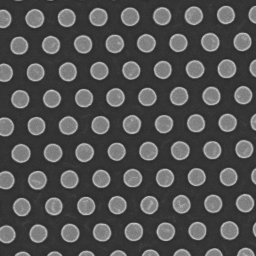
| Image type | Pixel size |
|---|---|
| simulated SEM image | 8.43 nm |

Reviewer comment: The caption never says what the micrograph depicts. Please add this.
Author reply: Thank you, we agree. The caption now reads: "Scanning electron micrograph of a regular array of raised bodies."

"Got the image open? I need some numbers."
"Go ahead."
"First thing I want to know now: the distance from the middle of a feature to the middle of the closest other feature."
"0.26 µm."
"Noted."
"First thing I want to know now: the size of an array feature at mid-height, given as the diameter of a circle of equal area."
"155 nm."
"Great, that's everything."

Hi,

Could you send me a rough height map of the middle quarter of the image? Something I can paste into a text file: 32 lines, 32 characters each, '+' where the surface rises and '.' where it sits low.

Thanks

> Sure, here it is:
+++....++++....++++....++++....+
+++....++++....++++....++++....+
+++....++++....++++....++++....+
+++....+++......++......++......
................................
................................
....++......++.....+++.....++++.
...++++....++++....++++....++++.
...++++....++++....++++...+++++.
...++++....++++....++++....+++..
....++......+...................
................................
................................
++......++.....++++....++++....+
+++....++++....++++....++++....+
+++....++++....++++....++++....+
+++....++++....++++....++++.....
++......++......................
................................
............................++..
....+++....++++....++++....++++.
...++++....++++....++++....++++.
...+++++...++++....++++....++++.
...++++.....+++....++++.....++..
................................
................................
................++......+++.....
+++.....+++....++++....++++....+
++++...+++++...++++....++++....+
++++...++++....++++....++++....+
+++.....+++.....++......++......
................................